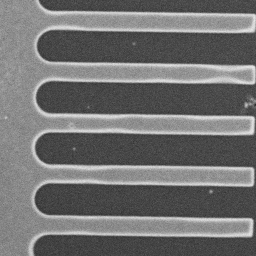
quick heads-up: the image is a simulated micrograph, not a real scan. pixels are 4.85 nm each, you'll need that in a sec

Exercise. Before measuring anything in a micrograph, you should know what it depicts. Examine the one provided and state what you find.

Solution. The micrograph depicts groups of lines, slits or small figures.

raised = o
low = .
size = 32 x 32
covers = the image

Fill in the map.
ooooo...........................
ooooooo.oooo....................
oooooooooooooooooooooooooooooooo
ooooooo.oooooooooooooooooooooooo
ooooo...........................
ooooo...........................
ooooo...........................
oooooo..........................
oooooooooooooooooooooooooooooooo
oooooooooooooooooooooooooooooooo
ooooo...........................
ooooo...........................
ooooo...........................
ooooo...........................
oooooooooooooooooooooooo........
oooooooooooooooooooooooooooooooo
oooooo..........ooooooooooooooo.
ooooo...........................
oooo............................
ooooo...........................
oooooo..........................
oooooooooooooooooooooooooooooooo
oooooooooooooooooooooooooooooooo
ooooo...........................
oooo............................
oooo............................
ooooo...........................
ooooooooooooooooooooooooooooooo.
ooooooooooooooooooooooooooooooo.
ooooo......................o....
oooo............................
oooo............................